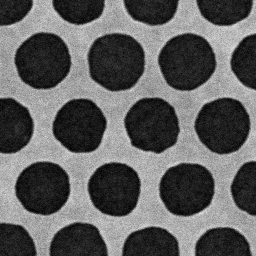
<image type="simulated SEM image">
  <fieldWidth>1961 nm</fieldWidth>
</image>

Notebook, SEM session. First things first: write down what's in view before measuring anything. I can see a regular array of holes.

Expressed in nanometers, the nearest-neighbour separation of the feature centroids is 549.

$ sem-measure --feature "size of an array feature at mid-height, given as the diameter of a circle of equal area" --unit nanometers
426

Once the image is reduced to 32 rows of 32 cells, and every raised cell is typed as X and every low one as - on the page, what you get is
----XXX------XX-------XXX-------
----XXX------XXX------XXX------X
---XXXXX----XXXXX----XXXXX----XX
XXXXXXXXXXXXXXXXXXXXXXXXXXXXXXXX
XXXX---XXXXXX---XXXXXX---XXXXXX-
XXX-----XXXX------XXX-----XXXX--
XX-------XX-------XX-------XX---
XX-------XX-------XX-------XX---
XX-------XX-------XX-------XX---
XX------XXX-------XX------XXX---
XXX----XXXXX-----XXXX----XXXXX--
XXXXXXXXXXXXXXXXXXXXXXXXXXXXXXXX
--XXXXXXX--XXXXXX----XXXXXX---XX
---XXXXX----XXXX------XXX------X
----XXX------XXX------XXX------X
----XXX------XXX------XX-------X
----XXX------XXX------XX-------X
----XXX------XXX------XXX------X
---XXXXX----XXXXX----XXXXX----XX
XXXXXXXXXXXXXXXXXXXXXXXXXXXXXXXX
XXXX---XXXXXX---XXXXXX---XXXXX--
XXX-----XXXX-----XXXX-----XXXX--
XX-------XX-------XX-------XX---
XX-------XX-------XX-------XX---
XX-------XX------XXX-------XX---
XXX-----XXXX-----XXX------XXX---
XXXX---XXXXXX---XXXXX----XXXXXX-
XXXXXXXXXXXXXXXXXXXXXXXXXXXXXXXX
---XXXXX----XXXXXX--XXXXXXX--XXX
----XXX------XXX------XXX-----XX
----XX-------XX-------XX-------X
-----X-------XX-------XX-------X